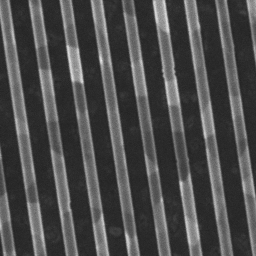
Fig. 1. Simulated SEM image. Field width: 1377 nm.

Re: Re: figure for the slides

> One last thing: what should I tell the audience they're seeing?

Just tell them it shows parallel lines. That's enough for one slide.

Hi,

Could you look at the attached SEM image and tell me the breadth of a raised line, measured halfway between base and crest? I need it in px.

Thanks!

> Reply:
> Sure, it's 11.1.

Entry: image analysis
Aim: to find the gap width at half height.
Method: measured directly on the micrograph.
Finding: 106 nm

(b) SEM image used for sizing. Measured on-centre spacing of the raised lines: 166 nm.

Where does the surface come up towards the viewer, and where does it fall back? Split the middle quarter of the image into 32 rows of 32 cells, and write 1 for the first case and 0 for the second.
00110000011100000111000001100000
00110000011100000111000001110000
00111000001100000111000001110000
00111000001100000111000001110000
00111000001100000011000001110000
00111000001110000011000001110000
00111000001110000011100000110000
00011000001110000011100000110000
00011000001110000011100000111000
00011100001110000011100000111000
00011100000110000011100000111000
00011100000110000001100000111000
00011100000111000001100000011000
00011100000111000001110000011000
00001100000111000001110000011000
00001100000111000001110000011100
00001110000011000001110000011100
00001110000011000001110000011100
00001110000011000000110000011100
00001110000011100000110000001100
00001110000011100000111000001100
00000110000011100000111000001110
00000110000011100000111000001110
00000111000001100000111000001110
00000111000001100000111000001110
00000111000001100000011000001110
00000111000001110000011000000110
00000111000001110000011100000110
10000011000001110000011100000111
10000011000001110000011100000111
10000011100000110000011100000111
10000011100000110000011100000111